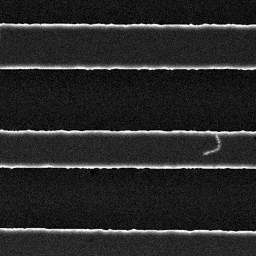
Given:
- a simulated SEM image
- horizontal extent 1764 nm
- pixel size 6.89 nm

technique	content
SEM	lines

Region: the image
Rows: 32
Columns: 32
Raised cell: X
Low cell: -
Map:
--------------------------------
--------------------------------
--------------------------------
XXXXXXXXXXXXXXXXXXXXXXXXXXXXXXXX
XXXXXXXXXXXXXXXXXXXXXXXXXXXXXXXX
XXXXXXXXXXXXXXXXXXXXXXXXXXXXXXXX
XXXXXXXXXXXXXXXXXXXXXXXXXXXXXXXX
XXXXXXXXXXXXXXXXXXXXXXXXXXXXXXXX
XXXXXXXXXXXXXXXXXXXXXXXXXXXXXXXX
--------------------------------
--------------------------------
--------------------------------
--------------------------------
--------------------------------
--------------------------------
--------------------------------
XXXXXXXXXXXXXX-XXXXXXXXXXXX---X-
XXXXXXXXXXXXXXXXXXXXXXXXXXXXXXXX
XXXXXXXXXXXXXXXXXXXXXXXXXXXXXXXX
XXXXXXXXXXXXXXXXXXXXXXXXXXXXXXXX
XXXXXXXXXXXXXXXXXXXXXXXXXXXXXXXX
--------------------------------
--------------------------------
--------------------------------
--------------------------------
--------------------------------
--------------------------------
--------------------------------
--------------------------------
XXXXXXXXXXXXXXXXXXXXXXXXXXXXXXXX
XXXXXXXXXXXXXXXXXXXXXXXXXXXXXXXX
XXXXXXXXXXXXXXXXXXXXXXXXXXXXXXXX